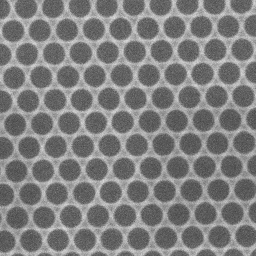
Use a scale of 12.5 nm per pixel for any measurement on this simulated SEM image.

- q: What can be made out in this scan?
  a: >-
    a regular array of holes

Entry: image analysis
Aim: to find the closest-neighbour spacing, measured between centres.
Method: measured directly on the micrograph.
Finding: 333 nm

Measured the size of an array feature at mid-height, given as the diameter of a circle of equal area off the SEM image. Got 290 nm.